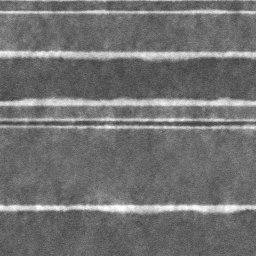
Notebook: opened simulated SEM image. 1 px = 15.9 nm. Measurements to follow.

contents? lines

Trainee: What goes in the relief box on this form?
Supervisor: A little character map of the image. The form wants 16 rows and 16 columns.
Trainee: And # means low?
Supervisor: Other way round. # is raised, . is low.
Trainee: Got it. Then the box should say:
################
################
################
................
................
................
................
################
################
################
################
################
################
................
................
................